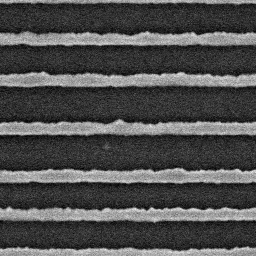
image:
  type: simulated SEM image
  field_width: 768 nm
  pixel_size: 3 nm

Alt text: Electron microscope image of lines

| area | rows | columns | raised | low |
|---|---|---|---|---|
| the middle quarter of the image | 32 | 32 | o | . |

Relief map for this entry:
................................
................................
............................oo..
oooooooooooooooooooooooooooooooo
oooooooooooooooooooooooooooooooo
...oo..ooo......................
................................
................................
................................
................................
................................
................................
................................
................................
.............oo.................
oooooooooooooooooooooooooooooooo
oooooooooooooooooooooooooooooooo
oo..ooo........oo.....o.......o.
................................
................................
................................
................................
................................
................................
................................
................................
o.........................oooo..
oooooooooooooooooooooooooooooooo
oooooooooooooooooooooooooooooooo
..o.........oooooo..ooo.ooooooo.
................................
................................